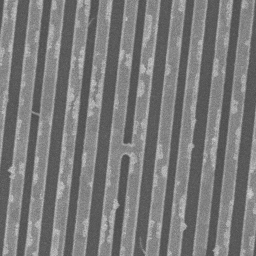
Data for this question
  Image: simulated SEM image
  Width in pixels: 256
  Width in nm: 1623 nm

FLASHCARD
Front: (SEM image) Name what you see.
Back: parallel lines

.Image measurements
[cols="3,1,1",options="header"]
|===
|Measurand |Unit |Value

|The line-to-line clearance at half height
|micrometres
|0.0804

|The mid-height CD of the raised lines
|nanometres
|75.7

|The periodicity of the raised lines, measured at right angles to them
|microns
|0.149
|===